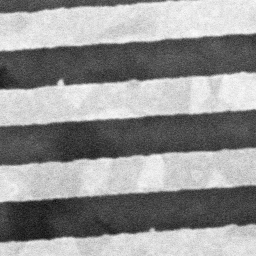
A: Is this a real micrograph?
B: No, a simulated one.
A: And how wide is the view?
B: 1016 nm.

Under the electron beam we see lines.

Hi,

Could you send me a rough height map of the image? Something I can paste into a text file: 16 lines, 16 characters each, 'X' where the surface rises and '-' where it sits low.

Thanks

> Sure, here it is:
-----XXXXXXXXXXX
XXXXXXXXXXXXXXXX
XXXXXXXXXX------
----------------
----------------
---XXXXXXXXXXXXX
XXXXXXXXXXXXXXXX
XXXXX-----------
----------------
-------------XXX
XXXXXXXXXXXXXXXX
XXXXXXXXXXXXXXXX
XX--------------
----------------
----------XXXXXX
XXXXXXXXXXXXXXXX